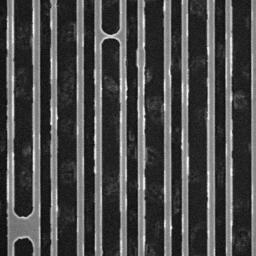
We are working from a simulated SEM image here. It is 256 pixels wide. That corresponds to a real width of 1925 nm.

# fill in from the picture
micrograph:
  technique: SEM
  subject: parallel lines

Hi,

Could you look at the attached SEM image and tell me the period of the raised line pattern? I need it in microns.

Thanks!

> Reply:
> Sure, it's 0.165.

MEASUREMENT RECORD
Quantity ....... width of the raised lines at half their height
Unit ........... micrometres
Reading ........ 0.0484